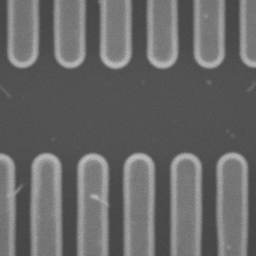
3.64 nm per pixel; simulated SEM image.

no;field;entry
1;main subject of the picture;groups of lines, slits or small figures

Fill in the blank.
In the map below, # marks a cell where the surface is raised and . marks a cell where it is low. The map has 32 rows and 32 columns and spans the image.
.###...###...###...###...###..##
.###...###...###...###...###..##
.####..###...###...###...###..##
.####..###...###...###...###..##
.####..###...###...###...###..##
.###...###...###...###...###..##
.###...###...###...###...###..##
..##....##...###...###...##....#
................................
................................
................................
................................
................................
................................
................................
................................
................................
................................
................................
................................
#...###...###...###...###...##..
#...###...###...###...###...###.
#...###...###...###...###...###.
##..###...###...###...###...###.
##..###...###...###...###...###.
##..###...###...###...###...###.
##..###...###...###...###...###.
##..###...###...###...###...###.
##..###...###...###...###...###.
#...###...###...###...###...###.
#...###...###...###...###...##..
#...###...###...###...###...##..